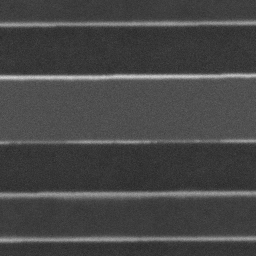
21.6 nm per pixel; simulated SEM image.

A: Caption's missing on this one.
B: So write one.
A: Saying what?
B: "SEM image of lines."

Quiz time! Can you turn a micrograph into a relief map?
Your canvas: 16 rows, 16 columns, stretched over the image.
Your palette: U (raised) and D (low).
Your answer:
UUUUUUUUUUUUUUUU
UUUUUUUUUUUUUUDD
DDDDDDDDDDDDDDDD
DDDDDDDDDDDDDDDD
DDDDDDDDDDDDDDDD
UUUUUUUUUUUUUUUU
UUUUUUUUUUUUUUUU
UUUUUUUUUUUUUUUU
UUUUUUUUUUUUUUUU
DDDDDDDDDDDDDDDD
DDDDDDDDDDDDDDDD
DDDDDDDDDDDDDDDD
UUUUUUUUUUUUUUUU
UUUUUUUUUUUUUUUU
UUUUUUUUUUUUUUUU
DDDDDDDDDDDDDDDD